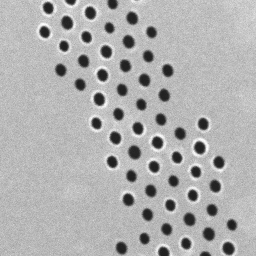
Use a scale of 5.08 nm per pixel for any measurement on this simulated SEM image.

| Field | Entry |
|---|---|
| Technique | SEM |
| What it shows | a regular array of holes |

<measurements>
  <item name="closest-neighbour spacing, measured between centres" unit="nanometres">121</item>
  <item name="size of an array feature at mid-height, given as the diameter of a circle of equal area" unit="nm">60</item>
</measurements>